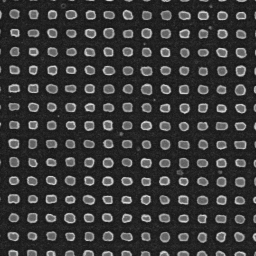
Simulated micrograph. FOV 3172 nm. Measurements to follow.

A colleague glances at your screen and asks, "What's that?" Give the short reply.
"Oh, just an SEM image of a regular array of raised bodies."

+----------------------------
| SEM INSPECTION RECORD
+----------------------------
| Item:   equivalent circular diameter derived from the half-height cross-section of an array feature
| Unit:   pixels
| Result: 9.57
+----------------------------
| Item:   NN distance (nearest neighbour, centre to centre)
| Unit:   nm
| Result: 225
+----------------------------